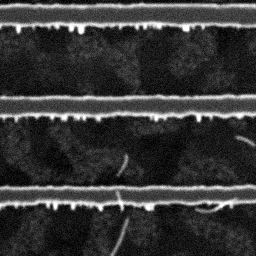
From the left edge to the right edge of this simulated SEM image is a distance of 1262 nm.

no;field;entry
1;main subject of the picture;lines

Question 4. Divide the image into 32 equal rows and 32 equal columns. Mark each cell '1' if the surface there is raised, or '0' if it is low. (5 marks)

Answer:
00000000000000000100000000000000
11111111111111111111111111111111
11111111111111111111111111111111
00000000000000000000000000000000
00000000000000000000000000000000
00000000000000000000000000000000
00000000000000000000000000000000
00000000000000000000000000000000
00000000000000000000000000000000
00000000000000000000000000000000
00000000000000000000000000000000
00000000000000000000000000000000
11111111111111111111111111111111
11111111111111111111111111111111
11100001000111000001111000011000
00000000000000000000000000000000
00000000000000000000000000000000
00000000000000000000000000000000
00000000000000000000000000000000
00000000000000000000000000000000
00000000000000000000000000000000
00000000000000000000000000000000
00000000000000000000000000000000
11111111111111111111111111111111
11111111111111111111111111111111
11110000001111111111000110011000
00000000000000000000000000000000
00000000000000000000000000000000
00000000000000000000000000000000
00000000000000000000000000000000
00000000000000000000000000000000
00000000000000000000000000000000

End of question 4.